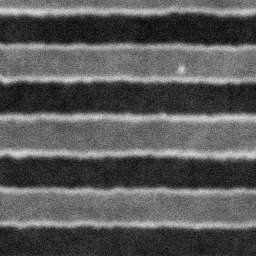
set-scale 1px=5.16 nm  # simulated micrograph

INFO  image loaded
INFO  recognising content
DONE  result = lines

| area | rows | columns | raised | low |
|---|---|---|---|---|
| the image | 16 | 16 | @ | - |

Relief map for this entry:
@@@@@@@@@@@@@@@@
----------------
----------------
@@@@@@@@@@@@@@@@
@@@@@@@@@@@@@@@@
----------------
----------------
@@@@@@@@@@@@@@@@
@@@@@@@@@@@@@@@@
@@@@@@@@@@@@@@@@
----------------
----------------
@@@@@@@@@@@@@@@@
@@@@@@@@@@@@@@@@
----------------
----------------